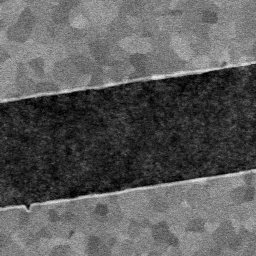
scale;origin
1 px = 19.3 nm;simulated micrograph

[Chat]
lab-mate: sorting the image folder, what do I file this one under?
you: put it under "one or a few lines or trenches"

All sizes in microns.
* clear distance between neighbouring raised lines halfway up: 2.08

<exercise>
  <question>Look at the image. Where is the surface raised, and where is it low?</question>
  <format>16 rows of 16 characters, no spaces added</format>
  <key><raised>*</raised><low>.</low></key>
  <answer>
****************
****************
****************
****************
************....
******..........
................
................
................
................
................
...........*****
....************
****************
****************
****************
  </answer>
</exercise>